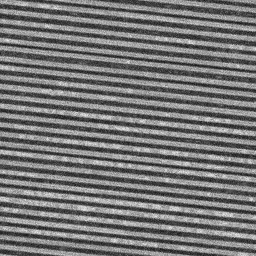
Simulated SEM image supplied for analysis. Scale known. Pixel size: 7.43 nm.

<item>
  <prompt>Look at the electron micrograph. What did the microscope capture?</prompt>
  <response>parallel lines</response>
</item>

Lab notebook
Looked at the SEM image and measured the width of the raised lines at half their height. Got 34.1 nm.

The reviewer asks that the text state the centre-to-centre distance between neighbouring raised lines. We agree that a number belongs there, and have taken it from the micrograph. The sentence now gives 0.0696 µm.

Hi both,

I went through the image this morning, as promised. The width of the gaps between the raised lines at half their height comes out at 35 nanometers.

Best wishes